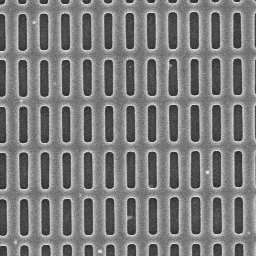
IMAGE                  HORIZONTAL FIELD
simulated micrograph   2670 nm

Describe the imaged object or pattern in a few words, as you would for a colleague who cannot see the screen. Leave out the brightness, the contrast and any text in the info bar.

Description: groups of lines, slits or small figures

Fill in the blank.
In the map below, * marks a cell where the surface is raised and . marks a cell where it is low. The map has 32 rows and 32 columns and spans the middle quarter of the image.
..***..***..***...***..***...**.
..***..***..***...***..***...**.
..***..***..***...***..***...**.
..***..***..***...***..***...**.
..***..***..***...***..***...**.
..***..***..***...***..***...**.
..***..***..***...***..***...**.
.****..***..****.****..***..****
********************************
********************************
***********.****.****..***..****
..***..***..***...***..***...**.
..***..***..***...***..***...**.
..***..***..***...***..***...**.
..***..***...**...***..***...**.
..***..***...**...***..***...**.
..***..***...**...***..***...**.
..***..***...**...***..***...***
..***..***..***...***..***...***
.**********.****.***************
********************************
********************************
..***..****.****..***..****.****
..***..***...**...***..***...***
..***..***...**...***..***...***
..***..***...**...***..***...***
..***..***...**...***..***...***
..***..***...**...***..***...***
..***..***...**...***..***...***
..***..***...***..***..***...**.
..***..***..****..***..****..***
********************************